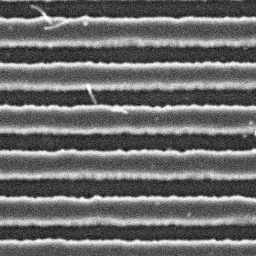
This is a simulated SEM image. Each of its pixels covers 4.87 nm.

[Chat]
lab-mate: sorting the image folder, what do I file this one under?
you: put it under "lines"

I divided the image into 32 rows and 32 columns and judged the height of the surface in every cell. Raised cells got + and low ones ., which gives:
................................
................................
++++++++++++++++++++++++++++++++
++++++++++++++++++++++++++++++++
++++++++++++++++++++++++++++++++
++++++++++++++++.+.+++++++++++++
................................
................................
++++++++++++++++++++++++++++++++
++++++++++++++++++++++++++++++++
++++++++++++++++++++++++++++++++
................................
................................
++++++++++++++++++++++++++++++++
++++++++++++++++++++++++++++++++
++++++++++++++++++++++++++++++++
..++..+++++++++.+++++.+...++++.+
................................
................................
++++++++++++++++++++++++++++++++
++++++++++++++++++++++++++++++++
++++++++++++++++++++++++++++++++
................................
................................
................................
++++++++++++++++++++++++++++++++
++++++++++++++++++++++++++++++++
++++++++++++++++++++++++++++++++
................................
................................
++++++++++++++++++++++++++++++++
++++++++++++++++++++++++++++++++